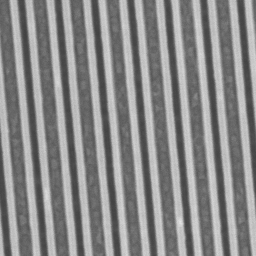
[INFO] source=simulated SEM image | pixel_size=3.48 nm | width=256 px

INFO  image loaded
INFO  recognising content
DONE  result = parallel lines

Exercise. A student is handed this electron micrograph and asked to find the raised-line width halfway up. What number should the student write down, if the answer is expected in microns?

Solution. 0.0272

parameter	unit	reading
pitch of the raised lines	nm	63.2